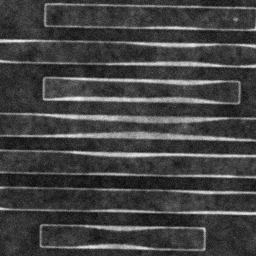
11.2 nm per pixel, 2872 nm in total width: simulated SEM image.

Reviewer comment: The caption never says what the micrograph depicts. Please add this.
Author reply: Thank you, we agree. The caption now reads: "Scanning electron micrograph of groups of lines, slits or small figures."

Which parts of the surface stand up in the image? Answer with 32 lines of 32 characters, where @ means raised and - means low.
--------------------------------
------@@@@@@@@@@@@@@@@@@@@@@@@@@
------@@@@@@@@@@@@@@@@@@@@@@@@@@
-----------------------@@@@@@@@@
--------------------------------
@@@@@@@@@@@@@@@@@@--------------
@@@@@@@@@@@@@@@@@@@@@@@@@@@@@@@@
@@@@@@@@@@@@@@@@@@@@@@@@@@@@@@@@
--------------------------------
--------------------------------
-----@@@@@@@@@@@@@@@@@@@@@@@@@--
-----@@@@@@@@@@@@@@@@@@@@@@@@@--
-----------------------@@@@@@@--
--------------------------------
@@@@@@@@------------------------
@@@@@@@@@@@@@@@@@@@@@@@@@@@@@@@@
@@@@@@@@@@@@@@@@@@@@@@@@@@@@@@@@
-------------------------------@
--------------------------------
@@@@@@@@@@@@@@@@@@@@@@@@@@@@@@@@
@@@@@@@@@@@@@@@@@@@@@@@@@@@@@@@@
@@@@@@@@@@@@@@@@@@@@@@@@@@@@@@@@
--------------------------------
@@@@@@--------------------------
@@@@@@@@@@@@@@@@@@@@@@@@@@@@@@@@
@@@@@@@@@@@@@@@@@@@@@@@@@@@@@@@@
------------------@@@@@@@@@@@@@@
--------------------------------
-----@@@@@@@@@----@@@@@@@-------
-----@@@@@@@@@@@@@@@@@@@@@------
-----@@@@@@@@@@@@@@@@@@@@@------
--------------------------------